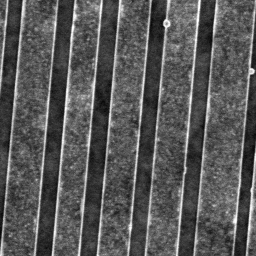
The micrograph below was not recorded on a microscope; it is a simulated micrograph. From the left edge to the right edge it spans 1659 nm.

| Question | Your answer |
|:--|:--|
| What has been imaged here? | parallel lines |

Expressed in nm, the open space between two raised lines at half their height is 110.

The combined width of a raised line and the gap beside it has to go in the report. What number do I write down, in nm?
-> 316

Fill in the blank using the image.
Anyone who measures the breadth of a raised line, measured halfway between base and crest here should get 0.209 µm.